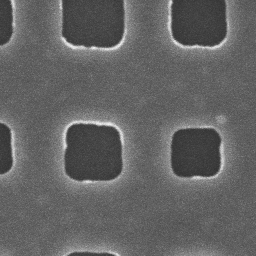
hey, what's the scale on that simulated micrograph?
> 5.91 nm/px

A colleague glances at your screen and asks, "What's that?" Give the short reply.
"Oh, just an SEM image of holes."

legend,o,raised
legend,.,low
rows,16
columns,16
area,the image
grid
.ooo....ooo...oo
.ooo....ooo...oo
.ooo....ooo...oo
oooooooooooooooo
oooooooooooooooo
oooooooooooooooo
oooooooooooooooo
oooooooooooooooo
.ooo...oooo...oo
.ooo....ooo...oo
.ooo....ooo...oo
oooooooooooooooo
oooooooooooooooo
oooooooooooooooo
oooooooooooooooo
oooooooooooooooo